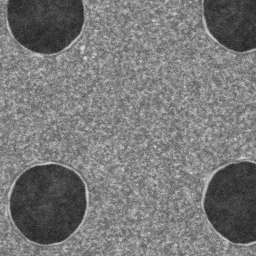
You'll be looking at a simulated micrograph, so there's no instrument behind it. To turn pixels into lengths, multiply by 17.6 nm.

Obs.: holes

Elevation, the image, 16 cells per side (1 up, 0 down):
0000011111111000
1000011111111000
1000011111111100
1111111111111111
1111111111111111
1111111111111111
1111111111111111
1111111111111111
1111111111111111
1111111111111111
1100111111111100
1000011111111000
1000011111111000
1000011111111000
1000011111111100
1111111111111111